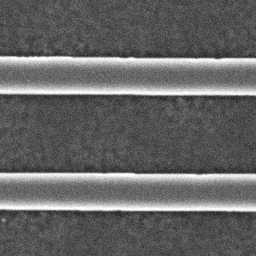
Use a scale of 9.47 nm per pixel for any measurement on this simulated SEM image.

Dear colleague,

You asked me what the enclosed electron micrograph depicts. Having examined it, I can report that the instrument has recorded lines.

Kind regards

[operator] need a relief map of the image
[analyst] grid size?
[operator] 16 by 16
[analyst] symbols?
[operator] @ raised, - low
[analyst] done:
----------------
----------------
----------------
----------------
@@@@@@@@@@@@@@@@
@@@@@@@@@@@@@@@@
----------------
----------------
----------------
----------------
----------------
@@@@@@@@@@@@@@@@
@@@@@@@@@@@@@@@@
----------------
----------------
----------------